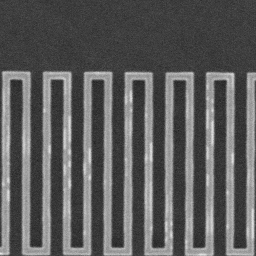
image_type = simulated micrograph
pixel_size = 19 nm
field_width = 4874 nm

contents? groups of lines, slits or small figures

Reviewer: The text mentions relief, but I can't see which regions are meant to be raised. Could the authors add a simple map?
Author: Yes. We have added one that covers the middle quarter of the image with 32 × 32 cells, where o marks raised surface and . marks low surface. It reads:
................................
................................
o....ooooooo...ooooooo....oooooo
o....ooooooo...ooooooo....oooooo
o....oo...oo...oo...oo....o....o
o....oo...oo...oo...oo...oo....o
o....oo...oo...oo...oo...oo....o
o....oo...oo...oo...oo...oo....o
o....oo...oo...oo...oo...oo....o
o....oo...oo...oo...oo...oo....o
o....oo...oo...oo...oo...oo....o
o....oo...oo...oo...oo...oo....o
o....oo...oo...oo...oo...oo....o
o....oo...oo...oo...oo...oo....o
o....oo...oo...oo...oo...oo....o
o....oo...oo...oo...oo...oo....o
o....oo...oo...oo...oo...oo....o
o....oo...oo...oo...oo...oo....o
o....oo...oo...oo...oo...oo....o
o....oo...oo...oo...oo...oo....o
o....oo...oo...oo...oo...oo....o
o....oo...oo...oo...oo...oo....o
o....oo...oo...oo...oo...oo....o
o....oo...oo...oo...oo...oo....o
o....oo...oo...oo...oo...oo....o
o....oo...oo...oo...oo...oo....o
o....oo...oo...oo...oo...oo....o
o....oo...oo...oo...oo...oo....o
o....oo...oo...oo...oo...oo....o
o....oo...oo...oo...oo...oo....o
o....oo...oo...oo...oo...oo....o
o....oo...oo...oo...oo...oo....o